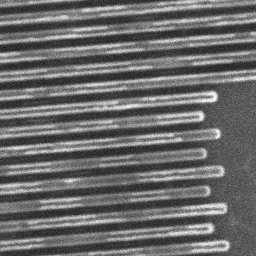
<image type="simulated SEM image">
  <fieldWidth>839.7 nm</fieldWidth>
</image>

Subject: parallel lines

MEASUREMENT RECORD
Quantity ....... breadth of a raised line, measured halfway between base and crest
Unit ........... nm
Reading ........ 31.5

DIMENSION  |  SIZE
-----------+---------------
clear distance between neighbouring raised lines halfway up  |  9.45 pixels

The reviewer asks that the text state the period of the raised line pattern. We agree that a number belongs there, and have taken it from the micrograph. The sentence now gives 61.4 nanometers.